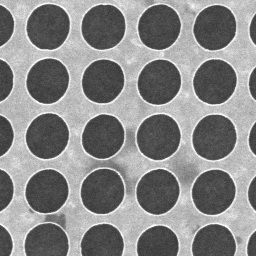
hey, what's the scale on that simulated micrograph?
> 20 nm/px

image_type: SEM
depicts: a regular array of holes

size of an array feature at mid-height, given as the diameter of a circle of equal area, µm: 0.892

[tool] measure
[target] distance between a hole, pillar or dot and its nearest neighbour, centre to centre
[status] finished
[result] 1090 nm